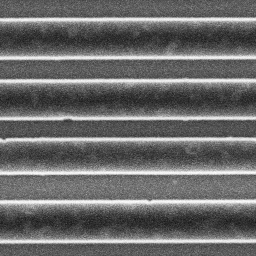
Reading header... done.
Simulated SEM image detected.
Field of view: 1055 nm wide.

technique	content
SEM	one or a few lines or trenches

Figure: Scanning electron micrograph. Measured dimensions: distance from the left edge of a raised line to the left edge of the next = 251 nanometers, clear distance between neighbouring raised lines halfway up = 0.0895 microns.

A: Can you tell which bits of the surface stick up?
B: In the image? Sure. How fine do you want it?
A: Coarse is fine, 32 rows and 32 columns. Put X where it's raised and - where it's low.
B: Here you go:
--------------------------------
--------------------------------
-XXXXXXXXXXXXXXXXXXXXXXXXXXXXXXX
XXXXXXXXXXXXXXXXXXXXXXXXXXXXXXXX
XXXXXXXXXXXXXXXXXXXXXXXXXXXXXXXX
XXXXXXXXXXXXXXXXXXXXXXXXXXXXXXXX
XXXXXXXXXXXXXXXXXXXXXXXXXXXXXXXX
--------------------------------
--------------------------------
--------------------------------
XXXXXXXXXXXXXXXXXXXXXXXXXXXXXXXX
XXXXXXXXXXXXXXXXXXXXXXXXXXXXXXXX
XXXXXXXXXXXXXXXXXXXXXXXXXXXXXXXX
XXXXXXXXXXXXXXXXXXXXXXXXXXXXXXXX
XXXXXXXXXXXXXXXXXXXXXXXXXXXXXXXX
--------------------------------
--------------------------------
-XXXXXXXXXXXXXXXXXXXXXXXXXXXXXXX
XXXXXXXXXXXXXXXXXXXXXXXXXXXXXXXX
XXXXXXXXXXXXXXXXXXXXXXXXXXXXXXXX
XXXXXXXXXXXXXXXXXXXXXXXXXXXXXXXX
XXXXXXXXXXXXXXXXXXXXXXXXXXXXXXXX
--------------------------------
--------------------------------
--------------------------------
XXXXXXXXXXXXXXXXXXXXXXXXXXXXXXXX
XXXXXXXXXXXXXXXXXXXXXXXXXXXXXXXX
XXXXXXXXXXXXXXXXXXXXXXXXXXXXXXXX
XXXXXXXXXXXXXXXXXXXXXXXXXXXXXXXX
XXXXXXXXXXXXXXXXXXXXXXXXXXXXXXXX
--------------------------------
--------------------------------